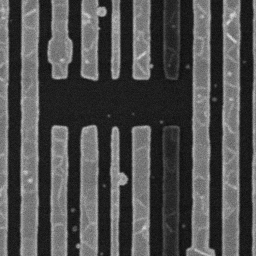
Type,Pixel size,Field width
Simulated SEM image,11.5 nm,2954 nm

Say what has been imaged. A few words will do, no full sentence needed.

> wiring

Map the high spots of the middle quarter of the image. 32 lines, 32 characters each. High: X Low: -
X----XXX----XX---XXXX----XXXX---
X----XXX----XX---XXXX----XXXX---
X----XXX----XX---XXXX----XXX----
------XX----X-----XXX-----XX----
--------------------------------
--------------------------------
--------------------------------
--------------------------------
--------------------------------
--------------------------------
--------------------------------
--------------------------------
--------------------------------
--------------------------------
--------------------------------
------XX------------------------
X----XXX----X----XXXX----XXXX---
X----XXX----XX---XXXX----XXXX---
X---XXXX----XX---XXXX----XXXX---
X---XXXX----XX---XXXX----XXXX---
X---XXXX----XX---XXXX----XXXX---
X---XXXX----XX---XXXX----XXXX---
X----XXX----XX---XXXX----XXXX---
X---XXXX----XX---XXXX----XXXX---
X---XXXX----XX---XXXX----XXXX---
X---XXXX----XX---XXXX----XXXX---
X---XXXX----XX---XXXX----XXXX---
X---XXXX----XX---XXXX----XXXX---
X---XXXX----XXXX-XXXX----XXXX---
X---XXXX----XXX--XXXX----XXXX---
----XXXX----XX---XXXX----XXXX---
----XXXX----XX---XXXX----XXXX---